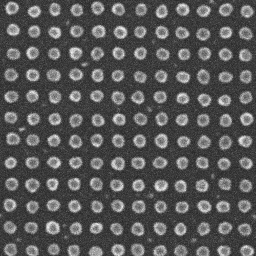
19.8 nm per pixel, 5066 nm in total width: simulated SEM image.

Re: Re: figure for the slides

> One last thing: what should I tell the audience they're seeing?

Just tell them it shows a regular array of raised bodies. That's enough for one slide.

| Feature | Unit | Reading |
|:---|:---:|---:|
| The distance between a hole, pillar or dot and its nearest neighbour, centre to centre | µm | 0.407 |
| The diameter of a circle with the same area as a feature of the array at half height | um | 0.224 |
